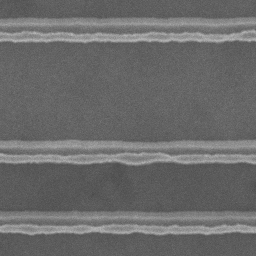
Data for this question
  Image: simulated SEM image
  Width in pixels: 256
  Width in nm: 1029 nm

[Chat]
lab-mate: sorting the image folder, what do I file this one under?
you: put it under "lines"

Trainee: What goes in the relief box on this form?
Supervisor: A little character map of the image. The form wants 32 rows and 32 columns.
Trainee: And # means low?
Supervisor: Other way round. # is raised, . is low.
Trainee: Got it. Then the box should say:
................................
................................
................................
################################
################################
................................
................................
................................
................................
................................
................................
................................
................................
................................
................................
................................
................................
................................
################################
################################
................##..............
................................
................................
................................
................................
................................
................................
################################
################################
................................
................................
................................